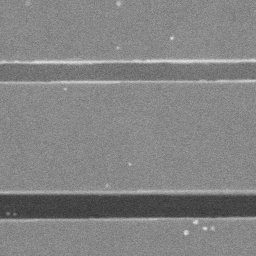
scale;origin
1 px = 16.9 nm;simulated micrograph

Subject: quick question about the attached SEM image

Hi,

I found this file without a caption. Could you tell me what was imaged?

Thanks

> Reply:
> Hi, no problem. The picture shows lines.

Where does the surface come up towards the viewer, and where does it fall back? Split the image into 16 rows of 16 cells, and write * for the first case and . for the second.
****************
****************
****************
****************
****************
****************
****************
****************
****************
****************
****************
****************
................
................
****************
****************